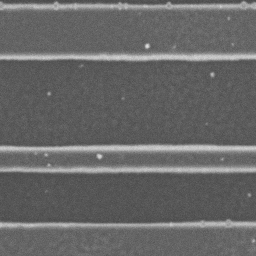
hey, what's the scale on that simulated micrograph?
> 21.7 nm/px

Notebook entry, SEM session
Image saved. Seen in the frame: lines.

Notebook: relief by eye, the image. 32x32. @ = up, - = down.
------------------------------@-
@@@@@@@@@@@@@@@@@@@@@@@@@@@@@@@@
@@@@@@@@@@@@@@@@@@@@@@@@@@@@@@@@
@@@@@@@@@@@@@@@@@@@@@@@@@@@@@@@@
@@@@@@@@@@@@@@@@@@@@@@@@@@@@@@@@
@@@@@@@@@@@@@@@@@@@@@@@@@@@@@@@@
@@@@@@@@@@@@@@@@@@@@@@@@@@@@@@@@
--------------------------------
--------------------------------
--------------------------------
--------------------------------
--------------------------------
--------------------------------
--------------------------------
--------------------------------
--------------------------------
--------------------------------
--------------------------------
--------------------------------
@@@@@@@@@@@@@@@@@@@@@@@@@@@@@@@@
@@@@@@@@@@@@@@@@@@@@@@@@@@@@@@@@
--------------------------------
--------------------------------
--------------------------------
--------------------------------
--------------------------------
--------------------------------
--------------------------------
@@@@@@@@@@@@@@@@@@@@@@@@@@@@@@@@
@@@@@@@@@@@@@@@@@@@@@@@@@@@@@@@@
@@@@@@@@@@@@@@@@@@@@@@@@@@@@@@@@
@@@@@@@@@@@@@@@@@@@@@@@@@@@@@@@@